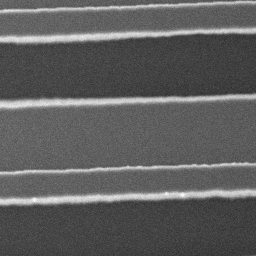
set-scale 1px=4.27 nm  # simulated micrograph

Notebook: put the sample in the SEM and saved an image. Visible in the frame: lines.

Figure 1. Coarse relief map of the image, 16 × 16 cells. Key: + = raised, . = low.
++++++++++++++++
++++++++++++++++
................
................
................
................
...+++++++++++++
++++++++++++++++
++++++++++++++++
++++++++++++++++
++++++++++++++++
++++++++++++++++
+++.............
................
................
................